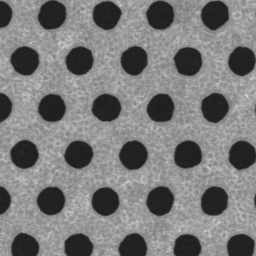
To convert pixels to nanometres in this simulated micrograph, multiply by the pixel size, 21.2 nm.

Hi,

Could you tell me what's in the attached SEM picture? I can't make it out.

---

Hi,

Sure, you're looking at a regular array of holes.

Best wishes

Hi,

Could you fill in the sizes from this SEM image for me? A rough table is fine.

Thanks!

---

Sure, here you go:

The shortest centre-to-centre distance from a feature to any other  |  1140 nanometres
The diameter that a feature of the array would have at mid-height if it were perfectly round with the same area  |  28.8 pixels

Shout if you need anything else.